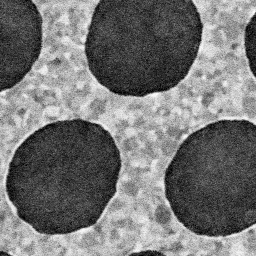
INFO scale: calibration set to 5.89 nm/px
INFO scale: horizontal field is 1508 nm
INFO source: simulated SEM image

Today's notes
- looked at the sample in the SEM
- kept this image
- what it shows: holes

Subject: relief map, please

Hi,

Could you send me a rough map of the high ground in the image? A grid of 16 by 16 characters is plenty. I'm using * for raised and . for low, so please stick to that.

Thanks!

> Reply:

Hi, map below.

..****......****
...***.......**.
...**........**.
..***.......***.
..****......****
.******....*****
****************
****.*********..
**.....*****....
*......****.....
........**......
.......***......
*......***......
*.....*****.....
**...*******...*
****************